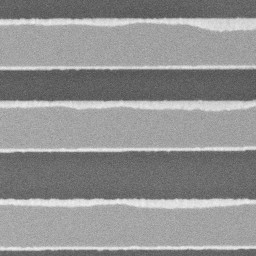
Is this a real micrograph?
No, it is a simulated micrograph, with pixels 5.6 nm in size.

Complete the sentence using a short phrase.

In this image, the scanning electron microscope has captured lines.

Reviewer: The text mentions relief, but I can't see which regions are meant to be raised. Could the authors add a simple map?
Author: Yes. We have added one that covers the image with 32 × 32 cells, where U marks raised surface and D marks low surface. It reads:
DDDDDDDDDDDDDDDDDDDDDDDDDDDDDDDD
DDDDDDDDDDDDDDDDDDDDDDDDDDDDDDDD
DDDDDDDDDDDDDDDDUUUUUDUDDDDDDDDD
UUUUUUUUUUUUUUUUUUUUUUUUUUUUUUUU
UUUUUUUUUUUUUUUUUUUUUUUUUUUUUUUU
UUUUUUUUUUUUUUUUUUUUUUUUUUUUUUUU
UUUUUUUUUUUUUUUUUUUUUUUUUUUUUUUU
UUUUUUUUUUUUUUUUUUUUUUUUUUUUUUUU
UUUUUUUUDUDDDUUDDDDDDDDDDDDDDDDD
DDDDDDDDDDDDDDDDDDDDDDDDDDDDDDDD
DDDDDDDDDDDDDDDDDDDDDDDDDDDDDDDD
DDDDDDDDDDDDDDDDDDDDDDDDDDDDDDDD
DDDDDDDDDDDDDDDDDDDDDDDDDDDDDDDD
UUUUUUUUUUUUUUUUUUUUUUUUUUUUUUUU
UUUUUUUUUUUUUUUUUUUUUUUUUUUUUUUU
UUUUUUUUUUUUUUUUUUUUUUUUUUUUUUUU
UUUUUUUUUUUUUUUUUUUUUUUUUUUUUUUU
UUUUUUUUUUUUUUUUUUUUUUUUUUUUUUUU
UUUUUUUUUUUUUUUUUUUUUUUUUUUUUUUU
DDDDDDDDDDDDDDDDDDDDDDDDDDDDDDDD
DDDDDDDDDDDDDDDDDDDDDDDDDDDDDDDD
DDDDDDDDDDDDDDDDDDDDDDDDDDDDDDDD
DDDDDDDDDDDDDDDDDDDDDDDDDDDDDDDD
DDDDDDDDDDDDDDDDDDDDDDDDDDDDDDDD
DDDDDDDDDDDDDDDDDDDDDDDDDDDDDDDD
UUUUUUUUUUUUUUUUUUUUUUUUUUUUUUUU
UUUUUUUUUUUUUUUUUUUUUUUUUUUUUUUU
UUUUUUUUUUUUUUUUUUUUUUUUUUUUUUUU
UUUUUUUUUUUUUUUUUUUUUUUUUUUUUUUU
UUUUUUUUUUUUUUUUUUUUUUUUUUUUUUUU
UUUUUUUUUUUUUUUUUUUUUUUUUUUUUUUU
DDDDDDDDDDDDDDDDDDDDDDDDDDDDDDDD